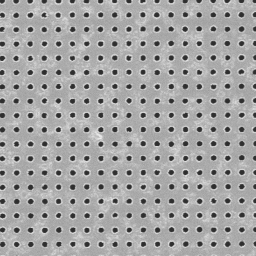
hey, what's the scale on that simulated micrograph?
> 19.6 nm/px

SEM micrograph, a regular array of holes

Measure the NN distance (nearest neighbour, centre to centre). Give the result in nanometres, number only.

274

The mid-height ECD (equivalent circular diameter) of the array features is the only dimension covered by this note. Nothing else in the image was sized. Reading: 109 nanometers